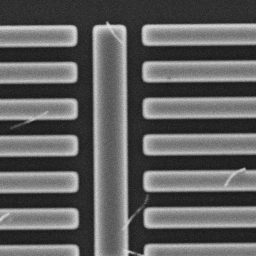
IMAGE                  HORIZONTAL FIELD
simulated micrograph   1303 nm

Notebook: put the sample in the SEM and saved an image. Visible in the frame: groups of lines, slits or small figures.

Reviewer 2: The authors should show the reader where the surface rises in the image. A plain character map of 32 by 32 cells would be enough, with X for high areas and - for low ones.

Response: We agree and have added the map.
--------------------------------
--------------------------------
--------------------------------
XXXXXXXXX---XXX---XXXXXXXXXXXXXX
XXXXXXXXX---XXXX--XXXXXXXXXXXXXX
XXXXXXXXX---XXXX--XXXXXXXXXXXXX-
------------XXXX----------------
------------XXXX----------------
XXXXXXXXX---XXXX--XXXXXXXXXXXXXX
XXXXXXXXX---XXXX--XXXXXXXXXXXXXX
------------XXXX----------------
------------XXXX----------------
------------XXXX--XXXXXXXXXXXXXX
XXXXXXXXXX--XXXX--XXXXXXXXXXXXXX
XXXXXXXXX---XXXX--XXXXXXXXXXXXXX
------------XXXX----------------
------------XXXX----------------
XXXXXXXXX---XXXX--XXXXXXXXXXXXXX
XXXXXXXXXX--XXXX--XXXXXXXXXXXXXX
------------XXXX----------------
------------XXXX----------------
------------XXXX-------XXXXXXXXX
XXXXXXXXXX--XXXX--XXXXXXXXXXXXXX
XXXXXXXXXX--XXXX--XXXXXXXXXXXXXX
------------XXXX----------------
------------XXXX----------------
XXXXXXXXX---XXXX--XXXXXXXXXXXXXX
XXXXXXXXXX--XXXX--XXXXXXXXXXXXXX
XXXXXXXXX---XXXX----------------
------------XXXX----------------
------------XXXX----------------
XXXXXXXXXX--XXXX--XXXXXXXXXXXXXX